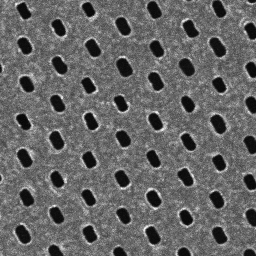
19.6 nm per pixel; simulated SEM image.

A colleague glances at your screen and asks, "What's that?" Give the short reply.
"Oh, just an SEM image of a regular array of holes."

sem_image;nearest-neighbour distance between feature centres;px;35.2